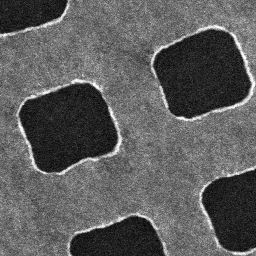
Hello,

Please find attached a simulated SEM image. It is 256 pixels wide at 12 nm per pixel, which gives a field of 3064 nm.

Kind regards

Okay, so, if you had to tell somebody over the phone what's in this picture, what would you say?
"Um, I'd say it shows holes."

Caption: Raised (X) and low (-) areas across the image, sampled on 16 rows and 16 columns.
----XXXXXXXXXXXX
---XXXXXXXXXXXXX
XXXXXXXXXXX----X
XXXXXXXXXX-----X
XXXXXXXXXX-----X
XXXX--XXXX------
XX-----XXX-----X
X------XXXXXXXXX
XX-----XXXXXXXXX
XX-----XXXXXXXXX
XX--XXXXXXXXXXXX
XXXXXXXXXXXXX---
XXXXXXXXXXXXX---
XXXXXXXXXXXXX---
XXXXX-----XXX---
XXXX------XXXX--